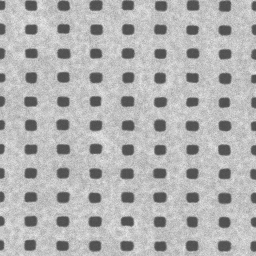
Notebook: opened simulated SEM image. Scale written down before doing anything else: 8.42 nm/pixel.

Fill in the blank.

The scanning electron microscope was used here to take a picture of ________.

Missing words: a regular array of holes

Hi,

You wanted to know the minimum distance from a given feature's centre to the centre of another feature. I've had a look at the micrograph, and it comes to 198 nanometers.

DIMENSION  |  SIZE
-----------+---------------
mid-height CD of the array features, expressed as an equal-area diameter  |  102 nm